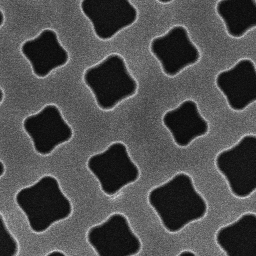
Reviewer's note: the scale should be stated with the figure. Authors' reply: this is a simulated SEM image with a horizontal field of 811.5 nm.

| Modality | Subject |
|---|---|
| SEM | a regular array of holes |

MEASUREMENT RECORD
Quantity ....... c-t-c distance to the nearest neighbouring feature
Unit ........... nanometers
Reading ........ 230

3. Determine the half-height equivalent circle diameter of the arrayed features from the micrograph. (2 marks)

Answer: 137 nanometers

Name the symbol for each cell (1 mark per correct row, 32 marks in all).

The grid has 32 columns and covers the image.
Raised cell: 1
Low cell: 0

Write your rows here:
11111111110000001111111111100000
11111111110000000111111111100000
11111111111000000111111111110000
11111111111100011111110111110001
11111001111100111111100111111011
11100001111111111110000011111111
11100000111111111110000001111111
11110000111110011111000011111111
11110001111100001111000111111000
11111111111000001111111111100000
11111111111000000111111111100000
11111111111100000111111111110000
11111111111100011111111111110000
11111101111110111111110001111011
11110000111111111111100001111111
11100000111111111111100000111111
11100000011111111111100000111111
11110000111111111111110011111100
11110001111111001111111111111000
11111111111100001111111111100000
11111111111000000111111111100000
11111111111100000111111111110000
11111001111100000111100011110000
11100001111110011111000011111000
11000000111111111110000001111101
11000000011111111110000000111111
11100000011111111111000000111111
11110001111110001111000011111100
01110011111100001111100111110000
01111111111000000111111111100000
00111111111000000111111111100000
00111111111100000111111111110000